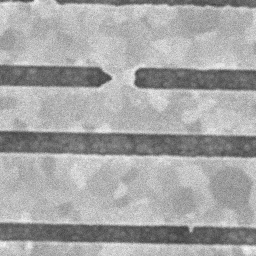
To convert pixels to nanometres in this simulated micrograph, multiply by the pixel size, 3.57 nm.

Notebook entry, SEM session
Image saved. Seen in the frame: one or a few lines or trenches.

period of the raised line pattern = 276 nm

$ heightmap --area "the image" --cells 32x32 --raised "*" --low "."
*******.........................
********************************
********************************
********************************
********************************
********************************
********************************
********************************
.............****........***.**.
..............***...............
.............****...............
*****************************...
********************************
********************************
********************************
********************************
...............*****************
................................
................................
***********.....................
********************************
********************************
********************************
********************************
********************************
********************************
********************************
********************************
................................
................................
**************..................
********************************